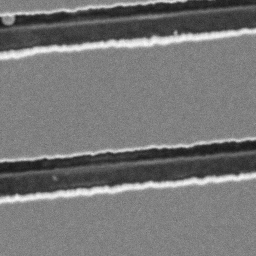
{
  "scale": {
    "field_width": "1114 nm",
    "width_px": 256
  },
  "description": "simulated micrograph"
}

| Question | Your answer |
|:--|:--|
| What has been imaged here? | lines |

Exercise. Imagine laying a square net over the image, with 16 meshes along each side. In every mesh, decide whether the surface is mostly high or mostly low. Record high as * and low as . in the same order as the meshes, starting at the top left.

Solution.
*******.........
................
........********
****************
****************
****************
****************
****************
****************
*******.........
................
.........*******
****************
****************
****************
****************